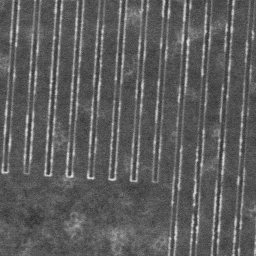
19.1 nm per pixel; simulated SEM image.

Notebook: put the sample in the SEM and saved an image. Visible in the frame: parallel lines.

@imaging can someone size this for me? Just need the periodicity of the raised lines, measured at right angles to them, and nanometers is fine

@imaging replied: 407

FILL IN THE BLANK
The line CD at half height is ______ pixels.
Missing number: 17.1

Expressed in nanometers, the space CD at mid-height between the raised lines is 83.3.